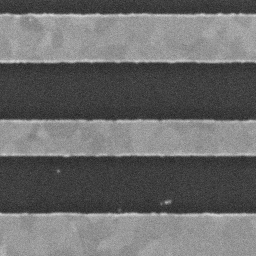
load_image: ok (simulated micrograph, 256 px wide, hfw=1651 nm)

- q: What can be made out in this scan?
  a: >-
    lines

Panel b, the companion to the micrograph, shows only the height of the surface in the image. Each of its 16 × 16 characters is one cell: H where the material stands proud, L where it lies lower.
LLLLLLLLLLLLLLLL
HHHHHHHHHHHHHHHH
HHHHHHHHHHHHHHHH
HHHHHHHHHHHHHHHH
LLLLLLLLLLLLLLLL
LLLLLLLLLLLLLLLL
LLLLLLLLLLLLLLLL
LLLLLLLLLLLLLLLL
HHHHHHHHHHHHHHHH
HHHHHHHHHHHHHHHH
LLLLLLLLLLLLLLLL
LLLLLLLLLLLLLLLL
LLLLLLLLLLLLLLLL
HHHHHHHHHHHHHHHH
HHHHHHHHHHHHHHHH
HHHHHHHHHHHHHHHH